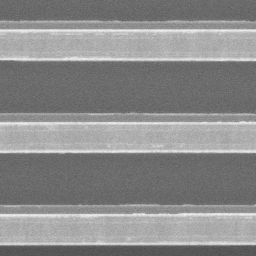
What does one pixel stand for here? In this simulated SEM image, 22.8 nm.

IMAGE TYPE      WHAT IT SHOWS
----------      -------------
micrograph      lines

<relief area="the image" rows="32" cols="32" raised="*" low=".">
................................
................................
................................
********************************
********************************
********************************
********************************
................*......*********
................................
................................
................................
................................
................................
................................
********************************
********************************
********************************
********************************
********************************
................................
................................
................................
................................
................................
................................
................................
********************************
********************************
********************************
********************************
********************************
................................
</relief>